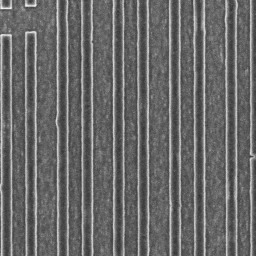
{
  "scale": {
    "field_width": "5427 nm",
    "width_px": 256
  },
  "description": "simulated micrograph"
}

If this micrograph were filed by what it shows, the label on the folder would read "parallel lines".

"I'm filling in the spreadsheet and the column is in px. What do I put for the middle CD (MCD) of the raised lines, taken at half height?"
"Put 10.2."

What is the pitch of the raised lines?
596 nm